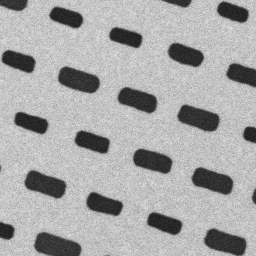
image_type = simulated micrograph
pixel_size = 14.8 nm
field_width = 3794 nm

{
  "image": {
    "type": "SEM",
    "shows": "a regular array of holes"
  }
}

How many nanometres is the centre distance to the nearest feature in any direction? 929